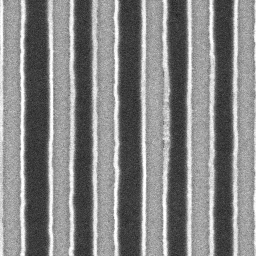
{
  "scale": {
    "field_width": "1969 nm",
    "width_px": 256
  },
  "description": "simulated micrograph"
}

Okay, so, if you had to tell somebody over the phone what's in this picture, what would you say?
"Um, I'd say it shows lines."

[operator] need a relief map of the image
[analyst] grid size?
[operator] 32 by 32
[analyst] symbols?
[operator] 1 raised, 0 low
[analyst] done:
00011100011100011100011100111100
00011100011100111100011100111100
00011100011100111100011100111000
00011100011100011100011100111000
00011100011100011100011100111000
00011100011100111100011100111000
00011100011100111100011100111000
00011100011100011100011100111000
00011100011100011100011100111000
00011100011100111100011100111000
00011100011100111100011100111000
00011100011100111100011100111000
00011100011100011100011100111000
00011100011100011100011100111000
00011100011100111100011100111000
00011100011100111100011100111000
00011100011100011100011100111100
00011100011100011100011100111100
00011100011100011100011100111000
00011100011100111100011100111000
00011100011100111100011100111000
00011100011100011100011100111000
00011100011100011100011100111000
00011100011100111100011100111000
00011100011100111100011100111000
00011100011100111100011100111000
00011100011100111100011100111000
00011100011100111100011100111000
00011100011100111100011100111000
00011100011100111100011100111000
00011100011100111100011100111000
00011100011100011100011100111000